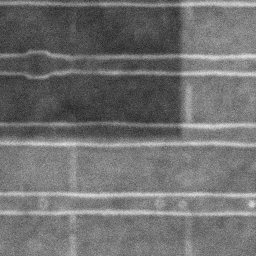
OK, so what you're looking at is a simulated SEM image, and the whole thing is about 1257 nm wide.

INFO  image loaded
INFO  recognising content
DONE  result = wiring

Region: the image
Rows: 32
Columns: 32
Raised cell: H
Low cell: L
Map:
LLLLLLHHHHHHHHHHHHHHHHHHHHLHHHHH
LLLLLLLLLLLLLLLLLLLLLLLLLLLLLLLL
LLLLLLLLLLLLLLLLLLLLLLLLLLLLLLLL
LLLLLLLLLLLLLLLLLLLLLLLLLLLLLLLL
LLLLLLLLLLLLLLLLLLLLLLLLLLLLLLLL
LLLLLLLLLLLLLLLLLLLLLLLLLLLLLLLL
LLLLHHLLLLLLLLLLLLLLLLLLLLLLLLLL
HHHHHHHHHHHHHHHHHHHHHHHHHHHHHHHH
HHHHHHHHHHHHHHHHHHHHHHHHHHHHHHHH
LLLHHHLLLLLLLLLLLLLLLLLLLLLLLLLL
LLLLLLLLLLLLLLLLLLLLLLLLLLLLLLLL
LLLLLLLLLLLLLLLLLLLLLLLLLLLLLLLL
LLLLLLLLLLLLLLLLLLLLLLLLLLLLLLLL
LLLLLLLLLLLLLLLLLLLLLLLLLLLLLLLL
LLLLLLLLLLLLLLLLLLLLLLLLLLLLLLLL
HHHHHHHHHHHHHHHHHLLLLLLLLLLLLLLL
HHHHHHHHHHHHHHHHHHHHHHHHHHHHHHHH
HHHHHHHHHHHHHHHHHHHHHHHHHHHHHHHH
LLLLLLLLLLLLLLLLLLLLLLLLLLLLLLLL
LLLLLLLLLLLLLLLLLLLLLLLLLLLLLLLL
LLLLLLLLLLLLLLLLLLLLLLLLLLLLLLLL
LLLLLLLLLLLLLLLLLLLLLLLLLLLLLLLL
LLLLLLLLLLLLLLLLLLLLLLLLLLLLLLLL
LLLLLLLLLLLLLLLLLLLLLLLLLLLLLLLL
HHHHHHHHHHHHHHHHHHHHHHHHHHHHHHHH
HHHHHHHHHHHHHHHHHHHHHHHHHHHHHHHH
HHHHHHHHHHHHHHHHHHHHHHHHHHHHHHHH
LLLLLLLLLLLLLLLLLLLLLLLLLLLLLLLL
LLLLLLLLLLLLLLLLLLLLLLLLLLLLLLLL
LLLLLLLLLLLLLLLLLLLLLLLLLLLLLLLL
LLLLLLLLLLLLLLLLLLLLLLLLLLLLLLLL
LLLLLLLLLLLLLLLLLLLLLLLLLLLLLLLL